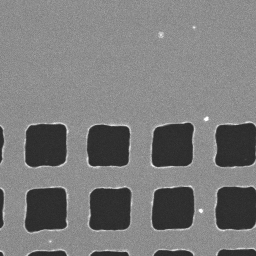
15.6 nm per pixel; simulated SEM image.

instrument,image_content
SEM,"holes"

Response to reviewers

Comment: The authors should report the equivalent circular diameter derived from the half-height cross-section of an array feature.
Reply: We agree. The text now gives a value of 720 nanometres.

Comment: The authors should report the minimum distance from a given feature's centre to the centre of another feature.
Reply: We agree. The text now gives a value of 63.2 px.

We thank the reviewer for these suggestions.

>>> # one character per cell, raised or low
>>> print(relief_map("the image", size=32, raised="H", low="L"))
HHHHHHHHHHHHHHHHHHHHHHHHHHHHHHHH
HHHHHHHHHHHHHHHHHHHHHHHHHHHHHHHH
HHHHHHHHHHHHHHHHHHHHHHHHHHHHHHHH
HHHHHHHHHHHHHHHHHHHHHHHHHHHHHHHH
HHHHHHHHHHHHHHHHHHHHHHHHHHHHHHHH
HHHHHHHHHHHHHHHHHHHHHHHHHHHHHHHH
HHHHHHHHHHHHHHHHHHHHHHHHHHHHHHHH
HHHHHHHHHHHHHHHHHHHHHHHHHHHHHHHH
HHHHHHHHHHHHHHHHHHHHHHHHHHHHHHHH
HHHHHHHHHHHHHHHHHHHHHHHHHHHHHHHH
HHHHHHHHHHHHHHHHHHHHHHHHHHHHHHHH
HHHHHHHHHHHHHHHHHHHHHHHHHHHHHHHH
HHHHHHHHHHHHHHHHHHHHHHHHHHHHHHHH
HHHHHHHHHHHHHHHHHHHHHHHHHHHHHHHH
HHHHHHHHHHHHHHHHHHHHHHHHHHHHHHHH
HHHHHLLHHHHHHHHHHHHHHLLLHHHHHHLL
HHHLLLLLHHHLLLLLHHHLLLLLHHHLLLLL
HHHLLLLLHHHLLLLLHHHLLLLLHHHLLLLL
HHHLLLLLHHHLLLLLHHHLLLLLHHHLLLLL
HHHLLLLLHHHLLLLLHHHLLLLLHHHLLLLL
HHHLLLLLHHHLLLLLHHHLLLLLHHHLLLLL
HHHHHHHHHHHHHHHHHHHHHHHHHHHHHHHH
HHHHHHHHHHHHHHHHHHHHHHHHHHHHHHHH
HHHHHLLLHHHHLHHLHHHHHHLLHHHHLLLL
LHHLLLLLHHHLLLLLHHHLLLLLHHHLLLLL
LHHLLLLLHHHLLLLLHHHLLLLLHHHLLLLL
HHHLLLLLHHHLLLLLHHHLLLLLHHHLLLLL
HHHLLLLLHHHLLLLLHHHLLLLLHHHLLLLL
HHHLLLLLHHHLLLLLHHHLLLLHHHHLLLLH
HHHHHHHHHHHHHHHHHHHHHHHHHHHHHHHH
HHHHHHHHHHHHHHHHHHHHHHHHHHHHHHHH
HHHHLLLLHHHHLLLLHHHHLLLLHHHLLLLL